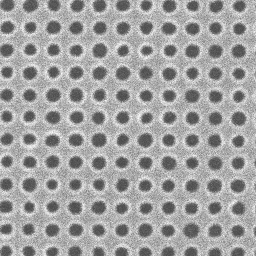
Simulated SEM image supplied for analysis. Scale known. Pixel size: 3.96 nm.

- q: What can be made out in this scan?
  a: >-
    a regular array of holes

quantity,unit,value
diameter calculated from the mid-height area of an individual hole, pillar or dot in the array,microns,0.0529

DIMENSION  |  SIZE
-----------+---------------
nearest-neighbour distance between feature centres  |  22.2 pixels